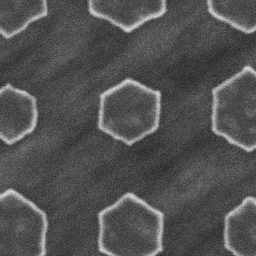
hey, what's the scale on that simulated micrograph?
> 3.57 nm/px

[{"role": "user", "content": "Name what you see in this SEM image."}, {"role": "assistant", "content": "raised bodies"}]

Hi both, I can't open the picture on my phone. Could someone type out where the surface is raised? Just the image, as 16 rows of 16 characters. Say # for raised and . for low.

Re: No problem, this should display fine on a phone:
###...####...###
##.....##.....##
................
................
...............#
#......##.....##
##....####...###
##....####...###
#......##.....##
................
................
................
##.....##......#
###...####....##
###...####....##
###...####....##